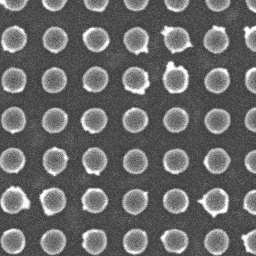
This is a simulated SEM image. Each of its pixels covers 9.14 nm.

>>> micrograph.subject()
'a regular array of raised bodies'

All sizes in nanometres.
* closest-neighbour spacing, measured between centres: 363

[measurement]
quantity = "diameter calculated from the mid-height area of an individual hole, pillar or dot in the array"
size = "227 nm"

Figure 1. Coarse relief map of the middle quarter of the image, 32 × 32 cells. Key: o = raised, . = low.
..........................oo....
......oooo......oooo......ooooo.
.....oooooo....oooooo....oooooo.
.....oooooo....oooooo....oooooo.
.....oooooo....oooooo....oooooo.
.....ooooo.....oooooo....oooooo.
......ooo.......oooo......oooo..
...................o............
................................
................................
................................
......ooo.......ooo........ooo..
.....ooooo.....ooooo......ooooo.
o...ooooooo....oooooo....oooooo.
o...ooooooo....oooooo....oooooo.
.....ooooo.....ooooo.....oooooo.
......ooo.......ooo.......oooo..
................................
................................
................................
................................
......ooo........oo........ooo..
.....ooooo......oooo......oooo..
o....oooooo....ooooo.....oooooo.
o....oooooo....oooooo....oooooo.
.....ooooo.....oooooo....oooooo.
.....ooooo......oooo......oooo..
........o.......................
................................
................................
................................
......ooo..................oo...